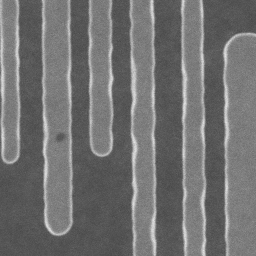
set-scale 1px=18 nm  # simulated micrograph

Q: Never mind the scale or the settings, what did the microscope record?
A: groups of lines, slits or small figures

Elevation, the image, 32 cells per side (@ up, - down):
@@---@@@@--@@@--@@@----@@-------
@@---@@@@--@@@--@@@----@@-------
@@---@@@@--@@@--@@@----@@-------
@@---@@@@--@@@--@@@----@@-------
@@---@@@@--@@@--@@@----@@----@@@
@@---@@@@--@@@--@@@----@@---@@@@
@@---@@@@--@@@--@@@----@@---@@@@
@@---@@@@--@@@--@@@----@@---@@@@
@@---@@@@--@@@---@@----@@---@@@@
@@---@@@@--@@@---@@----@@---@@@@
@@---@@@@--@@@---@@----@@---@@@@
@@---@@@@--@@@---@@----@@---@@@@
@@---@@@@--@@@---@@----@@---@@@@
@@----@@@--@@@---@@----@@@--@@@@
@@----@@@--@@@---@@----@@@--@@@@
@@----@@@--@@@---@@----@@---@@@@
@@----@@@--@@@---@@----@@---@@@@
@@----@@@--@@@---@@----@@@--@@@@
@@----@@@--@@@---@@----@@@--@@@@
@@----@@@--------@@----@@@--@@@@
------@@@--------@@----@@@--@@@@
------@@@--------@@----@@@--@@@@
------@@@--------@@----@@@--@@@@
------@@@--------@@----@@@--@@@@
------@@@--------@@----@@---@@@@
------@@@--------@@----@@---@@@@
------@@@--------@@----@@@--@@@@
------@@@--------@@----@@@--@@@@
------@@@--------@@----@@@--@@@@
-----------------@@----@@@--@@@@
-----------------@@----@@@--@@@@
-----------------@@----@@@--@@@@